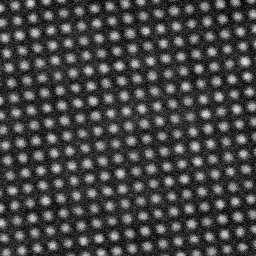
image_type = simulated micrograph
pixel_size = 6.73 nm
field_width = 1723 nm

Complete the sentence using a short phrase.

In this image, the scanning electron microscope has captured a regular array of raised bodies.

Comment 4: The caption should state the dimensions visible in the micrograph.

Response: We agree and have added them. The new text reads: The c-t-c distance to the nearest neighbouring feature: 101 nm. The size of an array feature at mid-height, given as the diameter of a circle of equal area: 51.5 nm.